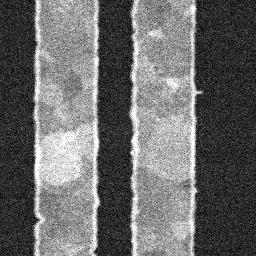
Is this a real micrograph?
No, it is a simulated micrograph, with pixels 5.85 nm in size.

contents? one or a few lines or trenches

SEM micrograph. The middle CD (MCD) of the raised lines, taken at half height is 337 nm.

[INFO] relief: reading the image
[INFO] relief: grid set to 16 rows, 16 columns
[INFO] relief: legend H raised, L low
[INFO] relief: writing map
LLHHHHLLHHHHLLLL
LLHHHHLLHHHHLLLL
LLHHHHLLHHHHLLLL
LLHHHHLLHHHHLLLL
LLHHHHLLHHHHLLLL
LLHHHHLLHHHHLLLL
LLHHHHLLHHHHLLLL
LLHHHHLLHHHHLLLL
LLHHHHLLHHHHLLLL
LLHHHHLLLHHHLLLL
LLHHHHLLHHHHLLLL
LLHHHHLLHHHHLLLL
LLHHHHLLHHHHLLLL
LLHHHHLLHHHHLLLL
LLHHHHLLHHHHLLLL
LLHHHHLLHHHHLLLL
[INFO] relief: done